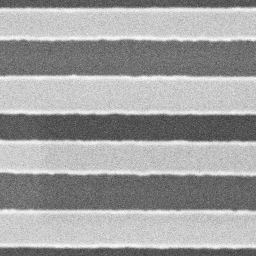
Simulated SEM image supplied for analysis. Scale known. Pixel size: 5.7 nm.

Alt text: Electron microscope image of lines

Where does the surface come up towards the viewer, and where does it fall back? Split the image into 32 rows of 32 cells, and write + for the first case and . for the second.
................................
++++++++++++++++++++++++++++++++
++++++++++++++++++++++++++++++++
++++++++++++++++++++++++++++++++
++++++++++++++++++++++++++++++++
................................
................................
................................
................................
.........+......................
++++++++++++++++++++++++++++++++
++++++++++++++++++++++++++++++++
++++++++++++++++++++++++++++++++
++++++++++++++++++++++++++++++++
................................
................................
................................
................................
++++++++++++++++++++++++++++++++
++++++++++++++++++++++++++++++++
++++++++++++++++++++++++++++++++
.+++++++++++++++++++++++++++++++
................................
................................
................................
................................
+++++++++++++++++++++++++++++++.
++++++++++++++++++++++++++++++++
++++++++++++++++++++++++++++++++
++++++++++++++++++++++++++++++++
++++++++++++++++++++++++++++++++
................................